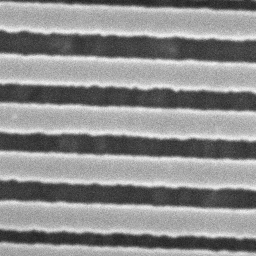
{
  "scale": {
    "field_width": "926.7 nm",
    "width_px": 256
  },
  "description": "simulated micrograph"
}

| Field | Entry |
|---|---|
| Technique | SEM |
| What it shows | lines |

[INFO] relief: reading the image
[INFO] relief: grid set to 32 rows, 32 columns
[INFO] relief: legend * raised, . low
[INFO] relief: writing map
*****...........................
********************************
********************************
********************************
...................**..*********
................................
................................
********************............
********************************
********************************
.....***************************
................................
................................
*****************...............
********************************
********************************
********************************
...............................*
................................
************.*..................
********************************
********************************
..******************************
..........................**...*
................................
*********.......................
********************************
********************************
********************************
.....................*....******
**..............................
*****************************...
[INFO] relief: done